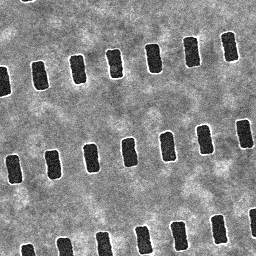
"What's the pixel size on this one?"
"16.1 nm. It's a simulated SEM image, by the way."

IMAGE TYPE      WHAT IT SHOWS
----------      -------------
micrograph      a regular array of holes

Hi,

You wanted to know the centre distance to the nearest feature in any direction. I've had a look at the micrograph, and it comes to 615 nanometers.